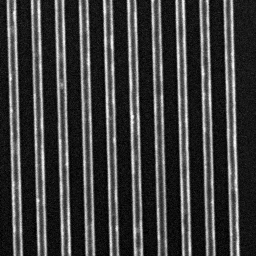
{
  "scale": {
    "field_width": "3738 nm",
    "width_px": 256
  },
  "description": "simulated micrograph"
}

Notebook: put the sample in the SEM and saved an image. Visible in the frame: parallel lines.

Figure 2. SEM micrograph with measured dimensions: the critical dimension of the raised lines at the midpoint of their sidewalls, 113 nm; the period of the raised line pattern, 24.1 px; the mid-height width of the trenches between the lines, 243 nm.